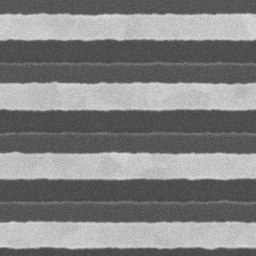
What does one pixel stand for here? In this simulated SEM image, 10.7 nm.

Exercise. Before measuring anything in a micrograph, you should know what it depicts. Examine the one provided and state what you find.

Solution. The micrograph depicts lines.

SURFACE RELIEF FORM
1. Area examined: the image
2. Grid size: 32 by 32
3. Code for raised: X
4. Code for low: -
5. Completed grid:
--------------------------------
--------------------------------
XXXXXXXXXXXXXXXXXXXXXXXXXXXXXXXX
XXXXXXXXXXXXXXXXXXXXXXXXXXXXXXXX
XXXXXXXXXXXXXXXXXXXXXXXXXXXXXXXX
--------------------------------
--------------------------------
--------------------------------
--------------------------------
--------------------------------
XXXXXXXXXXX-XXXXXXXXXXXXXXXX-XXX
XXXXXXXXXXXXXXXXXXXXXXXXXXXXXXXX
XXXXXXXXXXXXXXXXXXXXXXXXXXXXXXXX
XXXXXXXXXXXXXXXXXXXXXXXXXXXXXXXX
--------------------------------
--------------------------------
--------------------------------
--------------------------------
--------------------------------
XXXXXXXXXXXXXXXXXXXXXXXXXXXXXXXX
XXXXXXXXXXXXXXXXXXXXXXXXXXXXXXXX
XXXXXXXXXXXXXXXXXXXXXXXXXXXXXXXX
--------------------------------
--------------------------------
--------------------------------
--------------------------------
--------------------------------
--------------------------------
XXXXXXXXXXXXXXXXXXXXXXXXXXXXXXXX
XXXXXXXXXXXXXXXXXXXXXXXXXXXXXXXX
XXXXXXXXXXXXXXXXXXXXXXXXXXXXXXXX
--------------------------------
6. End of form